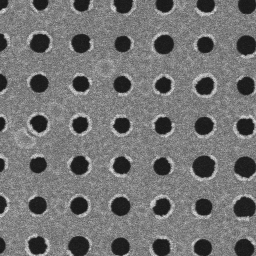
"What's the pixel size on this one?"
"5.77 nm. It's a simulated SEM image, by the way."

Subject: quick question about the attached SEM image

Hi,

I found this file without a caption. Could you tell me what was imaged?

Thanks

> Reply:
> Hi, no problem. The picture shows a regular array of holes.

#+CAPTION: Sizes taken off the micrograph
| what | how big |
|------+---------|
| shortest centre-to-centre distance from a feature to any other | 233 nanometers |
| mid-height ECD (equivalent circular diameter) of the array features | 103 nm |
